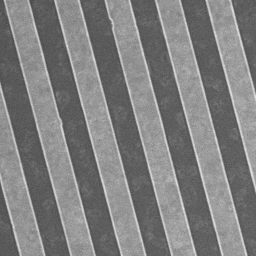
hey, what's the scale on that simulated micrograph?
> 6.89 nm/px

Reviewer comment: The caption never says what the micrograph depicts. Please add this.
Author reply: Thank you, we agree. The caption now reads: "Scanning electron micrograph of parallel lines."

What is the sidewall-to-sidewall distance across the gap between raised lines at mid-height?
178 nanometers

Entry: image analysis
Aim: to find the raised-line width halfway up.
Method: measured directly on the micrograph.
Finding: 160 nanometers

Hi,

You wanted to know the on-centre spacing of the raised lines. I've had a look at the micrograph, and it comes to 336 nanometres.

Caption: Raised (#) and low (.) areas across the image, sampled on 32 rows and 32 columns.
.###...###...###....###...###...
.###...###....###...###...###...
.###....###...###...###...###...
.###....###...###...###....###..
..###...###...###....###...###..
..###...###....###...###...###..
..###....###...###...###...###..
..###....###...###...###....###.
...###...###...###....###...###.
...###...###....###...###...###.
...###....###...###...###....###
....###...###...###...###....###
#...###...###...###....###...###
#...###...###....###...###...###
#...###....###...###...###....##
#....###...###...###....###...##
##...###...###...###....###...##
##...###...###....###...###...##
##...###....###...###...###....#
##....###...###...###....###...#
###...###...###...###....###...#
###...###....##....###...###...#
###...###....###...###...###....
###....###...###...###....###...
.###...###...###....###...###...
.###...###....###...###...###...
.###...###....###...###...###...
.###....###...###...###....###..
..###...###...###....###...###..
..###...###....###...###...###..
..###...###....###...###...###..
...##....###...###...###....###.